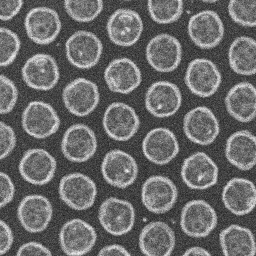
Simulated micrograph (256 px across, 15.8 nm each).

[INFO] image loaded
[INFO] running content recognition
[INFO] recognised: a regular array of raised bodies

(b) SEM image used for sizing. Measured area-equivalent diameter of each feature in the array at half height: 528 nanometres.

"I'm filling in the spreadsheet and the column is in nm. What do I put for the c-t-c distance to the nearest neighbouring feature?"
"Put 733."